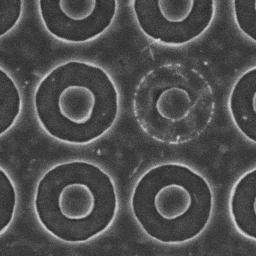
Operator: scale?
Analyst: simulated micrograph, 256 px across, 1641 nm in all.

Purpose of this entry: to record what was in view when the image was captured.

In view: ring-shaped grooves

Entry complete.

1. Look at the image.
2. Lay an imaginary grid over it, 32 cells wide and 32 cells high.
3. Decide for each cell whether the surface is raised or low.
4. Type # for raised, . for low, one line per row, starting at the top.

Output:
...##..#####..###...####...##...
...##...###...###...####...##...
..###.........###....##...####..
.#####.......#####........####..
#######.....#######......######.
#####################..#########
################################
################################
#######.....####################
.#####.......#################..
..###.........###############...
..###...###...###############...
..##...#####...##############...
..###...####...##############...
..###...###...###############...
..###.........################..
######.......#################..
########...#####################
################################
################################
########...#####################
######.......######.....#######.
.####.........####.......#####..
..###...###...###...###...###...
..###...###...###...####..###...
..##...#####...##..#####..###...
..###...###...###...###...###...
.####.........###.........###...
.#####.......#####.......#####..
#######.....#######.....#######.
################################
################################